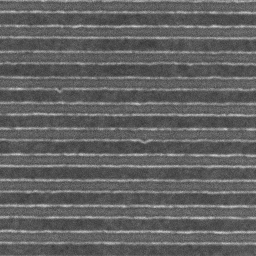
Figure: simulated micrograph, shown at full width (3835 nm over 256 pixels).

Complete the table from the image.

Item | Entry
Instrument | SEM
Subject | parallel lines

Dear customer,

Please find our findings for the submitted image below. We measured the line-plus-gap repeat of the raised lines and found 25.7 px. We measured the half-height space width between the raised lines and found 170 nm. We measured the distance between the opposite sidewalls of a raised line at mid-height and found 223 nm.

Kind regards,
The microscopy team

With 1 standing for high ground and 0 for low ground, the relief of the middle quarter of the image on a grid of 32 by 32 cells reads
11111111111111111111111111111111
11111111111111111111111111111111
11111111111111111111111111111111
00000000000000000001001111100011
00000000000000000000000000000000
00000000000000000000000000000000
11111111111111111111111111111111
11111111111111111111111111111111
11111111111111111111111111111111
11111111111111111111111111111111
00000000000000000000000000000000
00000000000000000000000000000000
00000000000000000000000000000000
11111111111111111111111111111111
11111111111111111111111111111111
11111111111111111111111111111111
00000000000000000000000000000000
00000000000000000000000000000000
00000000000000000000000000000000
11111111111111111111111111111111
11111111111111111111111111111111
11111111111111111111111111111111
10000001010111111111111111111111
00000000000000000000000000000000
00000000000000000000000000000000
10010000000000110000000000000000
11111111111111111111111111111111
11111111111111111111111111111111
11111111111111111111111111111111
00000000000000000000000000000000
00000000000000000000000000000000
00000000000000000000000000000000